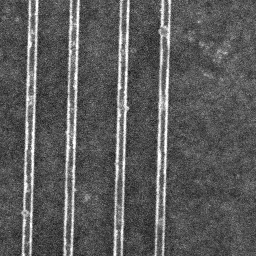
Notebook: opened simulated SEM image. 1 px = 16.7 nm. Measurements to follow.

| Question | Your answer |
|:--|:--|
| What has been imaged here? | parallel lines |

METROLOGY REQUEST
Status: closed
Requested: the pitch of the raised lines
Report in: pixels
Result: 44.2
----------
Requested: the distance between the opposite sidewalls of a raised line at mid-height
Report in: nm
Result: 127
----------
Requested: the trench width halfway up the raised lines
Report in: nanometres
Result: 560